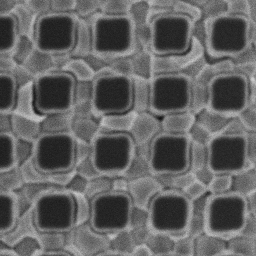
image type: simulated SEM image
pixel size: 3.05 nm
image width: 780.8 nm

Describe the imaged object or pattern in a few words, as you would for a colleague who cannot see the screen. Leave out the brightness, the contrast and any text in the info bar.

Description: a regular array of raised bodies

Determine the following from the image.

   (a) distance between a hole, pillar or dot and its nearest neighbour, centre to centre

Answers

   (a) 175 nm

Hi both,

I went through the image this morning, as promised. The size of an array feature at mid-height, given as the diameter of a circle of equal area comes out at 0.129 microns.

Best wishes